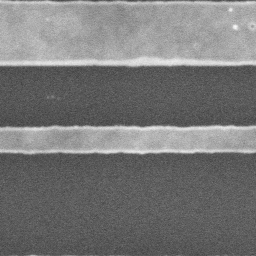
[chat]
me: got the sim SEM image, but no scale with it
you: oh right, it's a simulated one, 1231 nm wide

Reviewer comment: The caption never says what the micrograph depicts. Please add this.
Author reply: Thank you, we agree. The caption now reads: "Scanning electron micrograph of lines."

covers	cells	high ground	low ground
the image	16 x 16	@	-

@@@@@@@@@@@@@@@@
@@@@@@@@@@@@@@@@
@@@@@@@@@@@@@@@@
@@@@@@@@@@@@@@@@
----------------
----------------
----------------
----------------
@@@@@@@@@@@@@@@@
@@@@@@@@@@-@@@-@
----------------
----------------
----------------
----------------
----------------
----------------